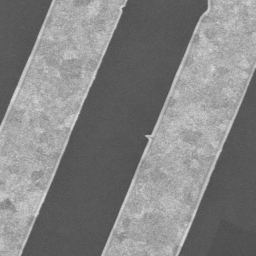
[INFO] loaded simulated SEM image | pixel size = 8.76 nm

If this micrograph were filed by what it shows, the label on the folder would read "one or a few lines or trenches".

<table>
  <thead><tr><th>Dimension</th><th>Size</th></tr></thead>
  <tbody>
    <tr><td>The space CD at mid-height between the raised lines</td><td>668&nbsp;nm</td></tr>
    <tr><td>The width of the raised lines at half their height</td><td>596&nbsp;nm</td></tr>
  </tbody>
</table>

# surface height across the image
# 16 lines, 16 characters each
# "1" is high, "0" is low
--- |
0001111100000111
0001111000001111
0011111000001111
0011110000001111
0011110000011111
0111110000011110
0111100000111110
1111100000111110
1111000001111100
1111000001111100
1111000001111000
1110000011111000
1110000011110000
1100000111110000
1100000111110000
1000000111100000